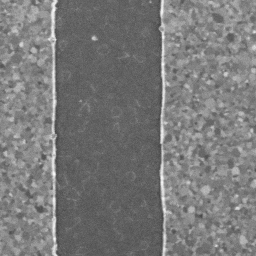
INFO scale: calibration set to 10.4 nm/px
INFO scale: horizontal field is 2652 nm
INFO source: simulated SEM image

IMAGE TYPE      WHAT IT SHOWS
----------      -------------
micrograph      one or a few lines or trenches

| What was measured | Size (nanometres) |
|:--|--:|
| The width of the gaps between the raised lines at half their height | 1130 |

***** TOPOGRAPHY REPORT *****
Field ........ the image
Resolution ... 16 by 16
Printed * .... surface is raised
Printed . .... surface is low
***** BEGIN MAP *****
***.......******
***.......******
***.......******
***.......******
***.......******
***.......******
***.......******
***.......******
***.......******
***.......******
***.......******
***.......******
***.......******
***.......******
***.......******
***.......******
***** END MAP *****